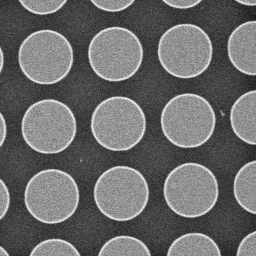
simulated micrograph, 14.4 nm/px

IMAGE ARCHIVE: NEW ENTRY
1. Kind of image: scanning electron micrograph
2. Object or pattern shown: an array of small figures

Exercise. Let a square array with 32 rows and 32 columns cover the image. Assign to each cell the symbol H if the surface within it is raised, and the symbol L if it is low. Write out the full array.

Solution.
LLLHHHHHLLLLHHHHLLLLLHHHHLLLLLHH
LLLLHHHLLLLLLLLLLLLLLLLLLLLLLLLL
LLLLLLLLLLLLLLLLLLLLLLLLLLLLLLLL
LLLLLLLLLLLLLLHLLLLLLLHHHLLLLLHH
LLLLHHHHLLLLHHHHHLLLHHHHHHLLLHHH
LLLHHHHHHLLHHHHHHHLLHHHHHHLLLHHH
LLHHHHHHHLLHHHHHHHLLHHHHHHLLLHHH
LLHHHHHHHLLHHHHHHHLLHHHHHHLLLHHH
LLLHHHHHHLLLHHHHHLLLLHHHHHLLLLHH
LLLHHHHHLLLLHHHHLLLLLLHHLLLLLLLL
LLLLLLLLLLLLLLLLLLLLLLLLLLLLLLLL
LLLLLLLLLLLLLLLLLLLLLLLLLLLLLLLH
LLLLLLHLLLLLLHHHLLLLLHHHHHLLLLHH
LLLLHHHHLLLLHHHHHLLLLHHHHHLLLHHH
LLLHHHHHHLLLHHHHHHLLHHHHHHHLLHHH
HLLHHHHHHLLHHHHHHHLLHHHHHHHLLHHH
HLLHHHHHHLLLHHHHHHLLHHHHHHHLLHHH
LLLHHHHHHLLLHHHHHLLLLHHHHHLLLLHH
LLLLHHHHLLLLLHHHLLLLLLLLLLLLLLLL
LLLLLLLLLLLLLLLLLLLLLLLLLLLLLLLL
LLLLLLLLLLLLLLLLLLLLLLLHLLLLLLLH
LLLLLHHHLLLLLHHHHLLLLLHHHHLLLLHH
LLLLHHHHHLLLHHHHHHLLLHHHHHHLLHHH
HLLHHHHHHHLLHHHHHHLLLHHHHHHLLHHH
HLLHHHHHHHLLHHHHHHLLLHHHHHHLLHHH
HLLHHHHHHHLLHHHHHHLLLHHHHHHLLLHH
HLLLHHHHHLLLLHHHHHLLLLHHHHLLLLLH
LLLLLHHHLLLLLLLHLLLLLLLLLLLLLLLL
LLLLLLLLLLLLLLLLLLLLLLLLLLLLLLLL
LLLLLLLLLLLLLLLLLLLLLLLHHHLLLLLH
LLLLLHHHHLLLLHHHHHLLLLHHHHHLLLHH
HLLLHHHHHHLLLHHHHHHLLHHHHHHLLLHH